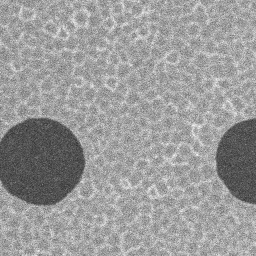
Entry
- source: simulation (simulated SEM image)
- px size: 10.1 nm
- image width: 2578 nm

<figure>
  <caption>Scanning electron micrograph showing holes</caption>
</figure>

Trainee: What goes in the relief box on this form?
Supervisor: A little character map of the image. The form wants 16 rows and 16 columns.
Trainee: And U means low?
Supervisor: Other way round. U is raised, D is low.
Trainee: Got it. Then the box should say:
UUUUUUUUUUUUUUUU
UUUUUUUUUUUUUUUU
UUUUUUUUUUUUUUUU
UUUUUUUUUUUUUUUU
UUUUUUUUUUUUUUUU
UUUUUUUUUUUUUUUU
UUUUUUUUUUUUUUUU
UUDUUUUUUUUUUUUD
DDDDDUUUUUUUUUDD
DDDDDUUUUUUUUUDD
DDDDDUUUUUUUUUDD
DDDDDUUUUUUUUUDD
UDDDUUUUUUUUUUUD
UUUUUUUUUUUUUUUU
UUUUUUUUUUUUUUUU
UUUUUUUUUUUUUUUU